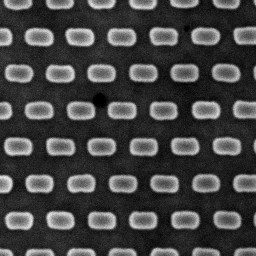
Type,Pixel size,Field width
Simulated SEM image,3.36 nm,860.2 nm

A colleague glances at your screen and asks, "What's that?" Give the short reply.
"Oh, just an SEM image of a regular array of raised bodies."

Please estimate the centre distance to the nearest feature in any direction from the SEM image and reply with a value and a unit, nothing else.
0.139 µm